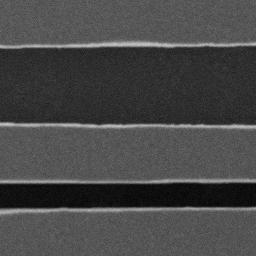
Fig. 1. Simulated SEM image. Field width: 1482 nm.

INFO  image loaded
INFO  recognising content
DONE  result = lines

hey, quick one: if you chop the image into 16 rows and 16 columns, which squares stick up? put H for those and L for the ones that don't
HHHHHHHHHHHHHHHH
HHHHHHHHHHHHHHHH
HHHHHHHHHHHHHHHH
LLLLLLLLLLLLLLLL
LLLLLLLLLLLLLLLL
LLLLLLLLLLLLLLLL
LLLLLLLLLLLLLLLL
LLLLLLLLLLLLLLLL
HHHHHHHHHHHHHHHH
HHHHHHHHHHHHHHHH
HHHHHHHHHHHHHHHH
LLLLLLLLLLLLLLLL
LLLLLLLLLLLLLLLL
HHHHHHHHHHHHHHHH
HHHHHHHHHHHHHHHH
HHHHHHHHHHHHHHHH